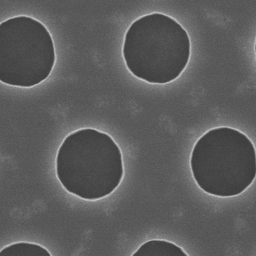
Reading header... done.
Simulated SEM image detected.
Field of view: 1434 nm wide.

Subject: holes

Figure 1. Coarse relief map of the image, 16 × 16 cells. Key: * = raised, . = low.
****************
...*****...*****
...*****....****
...*****....****
...*****...*****
****************
****************
****************
****...******..*
****...*****....
****....****....
****...*****....
****************
****************
****************
...******..*****